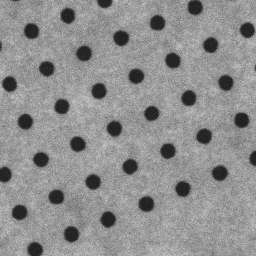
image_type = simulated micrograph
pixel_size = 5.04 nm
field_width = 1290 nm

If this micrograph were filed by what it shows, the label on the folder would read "a regular array of holes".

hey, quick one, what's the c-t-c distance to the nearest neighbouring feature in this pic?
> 200 nanometers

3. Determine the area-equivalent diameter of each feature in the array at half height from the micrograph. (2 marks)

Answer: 0.0764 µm